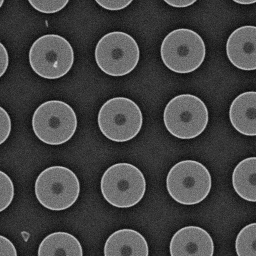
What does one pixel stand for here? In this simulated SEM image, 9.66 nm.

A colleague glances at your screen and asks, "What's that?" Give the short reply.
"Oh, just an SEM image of an array of small figures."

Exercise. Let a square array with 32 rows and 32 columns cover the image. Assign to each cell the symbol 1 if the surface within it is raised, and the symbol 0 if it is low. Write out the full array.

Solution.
00001111000011110000011100000000
00000110000000000000000000000000
00000000000000000000000000000000
00000000000000000000000000000011
00000010000001110000011110000111
00001111100011111000111110001111
10001111100011111000111111001111
10001111100011111000111110000111
10001111100001111000011110000011
00000111000000000000000000000000
00000000000000000000000000000000
00000000000000000000000000000000
00000000000000110000011110000111
00000111100001111000011111000111
10001111100011111100011111000111
10001111110011111100011111000111
10001111100001111000011110000011
10000111000000110000000000000000
00000000000000000000000000000000
00000000000000000000000000000000
00000000000000010000001110000011
00000111100001111100011111000111
10000111110001111100011111000111
11001111110001111100011111000111
11000111110001111100011111000011
10000111100000111000000000000000
00000000000000000000000000000000
00000000000000000000000000000000
00000000000000000000000110000001
00000011100000111100001111000011
10000111110001111100011111100011
11000111110001111100011111100011